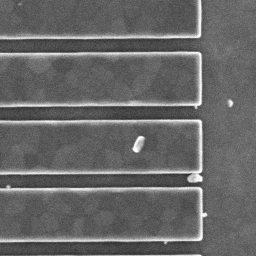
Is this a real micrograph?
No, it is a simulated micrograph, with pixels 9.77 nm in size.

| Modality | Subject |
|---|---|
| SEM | wiring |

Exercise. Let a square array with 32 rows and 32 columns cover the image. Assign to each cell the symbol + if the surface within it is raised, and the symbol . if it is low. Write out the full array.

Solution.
+++++++++++++++++++++++++.......
+++++++++++++++++++++++++.......
+++++++++++++++++++++++++.......
+++++++++++++++++++++++++.......
+++++++++++++++++++++++++.......
................................
......................++........
+++++++++++++++++++++++++.......
+++++++++++++++++++++++++.......
+++++++++++++++++++++++++.......
+++++++++++++++++++++++++.......
+++++++++++++++++++++++++.......
+++++++++++++++++++++++++.......
................................
................................
+++++++++++++++++++++++++.......
+++++++++++++++++++++++++.......
+++++++++++++++++++++++++.......
+++++++++++++++++++++++++.......
+++++++++++++++++++++++++.......
+++++++++++++++++++++++++.......
+++++++++++++++++++++++++.......
................................
.......................++.......
+++++++++++++++++++++++++.......
+++++++++++++++++++++++++.......
+++++++++++++++++++++++++.......
+++++++++++++++++++++++++.......
+++++++++++++++++++++++++.......
+++++++++++++++++++++++++.......
................................
................................